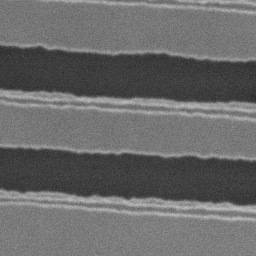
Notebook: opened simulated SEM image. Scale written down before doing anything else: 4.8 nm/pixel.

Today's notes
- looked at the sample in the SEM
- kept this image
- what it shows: lines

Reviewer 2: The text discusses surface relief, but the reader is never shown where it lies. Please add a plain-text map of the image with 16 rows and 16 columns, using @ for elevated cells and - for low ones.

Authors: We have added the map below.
@@@@@@@@@@@@@@@@
@@@@@@@@@@@@@@@@
@@@@@@@@@@@@@@@@
------------@@@@
----------------
----------------
@@@@@@@@@@@@@@@@
@@@@@@@@@@@@@@@@
@@@@@@@@@@@@@@@@
------@@@@@@@@@@
----------------
----------------
@@@@@@@@@@------
@@@@@@@@@@@@@@@@
@@@@@@@@@@@@@@@@
@@@@@@@@@@@@@@@@